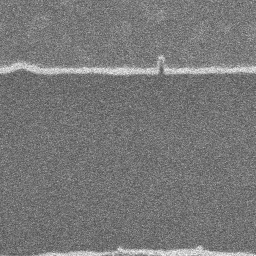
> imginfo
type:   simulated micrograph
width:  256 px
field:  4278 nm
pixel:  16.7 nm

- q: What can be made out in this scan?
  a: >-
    one or a few lines or trenches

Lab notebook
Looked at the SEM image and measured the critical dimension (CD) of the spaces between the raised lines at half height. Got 3040 nanometers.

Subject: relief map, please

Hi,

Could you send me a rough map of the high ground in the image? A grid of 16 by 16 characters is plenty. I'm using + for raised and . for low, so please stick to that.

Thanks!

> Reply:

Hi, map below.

++++++++++++++++
++++++++++++++++
++++++++++++++++
++++++++++++++++
................
................
................
................
................
................
................
................
................
................
................
................